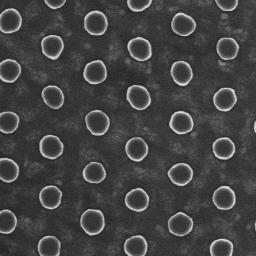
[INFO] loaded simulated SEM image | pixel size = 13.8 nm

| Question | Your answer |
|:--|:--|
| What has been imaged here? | a regular array of raised bodies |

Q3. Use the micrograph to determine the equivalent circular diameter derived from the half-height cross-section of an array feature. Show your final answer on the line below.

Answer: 22.3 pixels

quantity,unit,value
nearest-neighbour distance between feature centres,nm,675